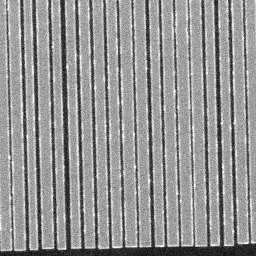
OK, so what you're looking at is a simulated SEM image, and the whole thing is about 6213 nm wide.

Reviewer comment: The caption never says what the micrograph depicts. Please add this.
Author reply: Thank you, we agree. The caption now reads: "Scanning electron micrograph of parallel lines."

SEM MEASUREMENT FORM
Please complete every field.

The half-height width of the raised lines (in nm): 246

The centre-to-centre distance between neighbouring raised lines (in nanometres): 338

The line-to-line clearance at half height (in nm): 94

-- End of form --